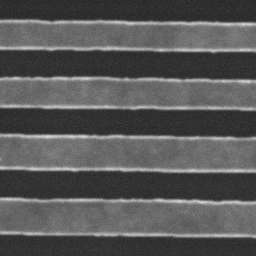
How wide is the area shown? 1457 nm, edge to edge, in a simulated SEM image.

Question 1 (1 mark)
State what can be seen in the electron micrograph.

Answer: lines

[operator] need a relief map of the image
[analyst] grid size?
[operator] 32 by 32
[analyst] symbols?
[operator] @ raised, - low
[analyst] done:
--------------------------------
--------------------------------
--------------------------------
@@@@@@@@@@@@@@@@@@@@@@@@@@@@@@@@
@@@@@@@@@@@@@@@@@@@@@@@@@@@@@@@@
@@@@@@@@@@@@@@@@@@@@@@@@@@@@@@@@
--------------------------------
--------------------------------
--------------------------------
--------------------------------
@@@@@@@@@@@@@@@@@@@@@@@@@@@@@@@@
@@@@@@@@@@@@@@@@@@@@@@@@@@@@@@@@
@@@@@@@@@@@@@@@@@@@@@@@@@@@@@@@@
-----@@@@@@@@@@@@@@@@@@@@@@@@@@@
--------------------------------
--------------------------------
--------------------------------
@@@@@@@@@@@@@@@@@@@@@@@@@@@@@@@@
@@@@@@@@@@@@@@@@@@@@@@@@@@@@@@@@
@@@@@@@@@@@@@@@@@@@@@@@@@@@@@@@@
@@@@@@@@@@@@@@@@@@@@@@@@@@@@@@@@
--------------------------------
--------------------------------
--------------------------------
--------------------------------
@@@@@@@@@@@@@@@@@@@@@@@@@@@@@@@@
@@@@@@@@@@@@@@@@@@@@@@@@@@@@@@@@
@@@@@@@@@@@@@@@@@@@@@@@@@@@@@@@@
@@@@@@@@@@@@@@@@@@@@@@@@@@@@@@@@
----------------------@@@@@@@@@@
--------------------------------
--------------------------------